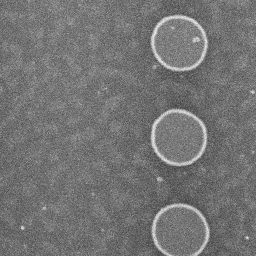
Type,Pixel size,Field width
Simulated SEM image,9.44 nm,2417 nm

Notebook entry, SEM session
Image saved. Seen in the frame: raised bodies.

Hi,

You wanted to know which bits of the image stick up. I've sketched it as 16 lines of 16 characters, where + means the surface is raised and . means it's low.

................
..........++....
..........+++...
..........+++...
................
................
................
..........++....
..........+++...
..........+++...
................
................
................
..........+++...
..........+++...
..........+++...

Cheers